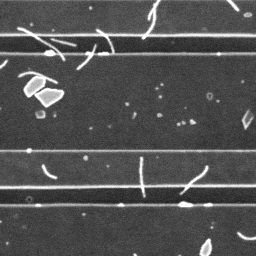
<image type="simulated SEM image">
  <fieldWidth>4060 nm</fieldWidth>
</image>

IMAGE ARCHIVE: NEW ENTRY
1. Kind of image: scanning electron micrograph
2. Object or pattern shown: lines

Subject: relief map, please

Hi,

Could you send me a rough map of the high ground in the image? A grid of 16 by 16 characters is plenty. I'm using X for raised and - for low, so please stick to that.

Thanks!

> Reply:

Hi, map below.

XXXXXXXXXXXXXXXX
XXXXXXXXXXXXXXXX
----------------
----------------
----------------
----------------
----------------
----------------
----------------
XXXXXXXXXXXXXXXX
XXXXXXXXXXXXXXXX
XXXXXXXXXXXXXXXX
----------------
----------------
----------------
----------------